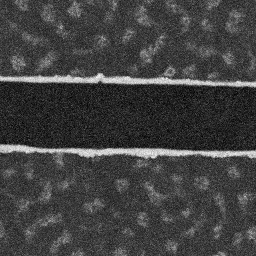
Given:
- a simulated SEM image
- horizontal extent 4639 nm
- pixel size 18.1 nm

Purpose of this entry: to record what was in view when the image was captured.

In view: one or a few lines or trenches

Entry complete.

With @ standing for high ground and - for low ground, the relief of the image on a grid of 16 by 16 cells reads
@@@@@@@@@@@@@@@@
@@@@@@@@@@@@@@@@
@@@@@@@@@@@@@@@@
@@@@@@@@@@@@@@@@
@@@@@@@@@@@@@@@@
----------------
----------------
----------------
----------------
@@@@@-@@@@@-@---
@@@@@@@@@@@@@@@@
@@@@@@@@@@@@@@@@
@@@@@@@@@@@@@@@@
@@@@@@@@@@@@@@@@
@@@@@@@@@@@@@@@@
@@@@@@@@@@@@@@@@